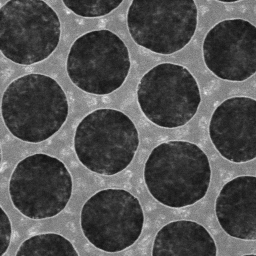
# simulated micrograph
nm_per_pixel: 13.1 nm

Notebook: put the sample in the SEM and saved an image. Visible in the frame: holes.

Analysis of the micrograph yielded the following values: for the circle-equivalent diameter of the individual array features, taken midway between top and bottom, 833 nm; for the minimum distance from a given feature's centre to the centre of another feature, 1.02 um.